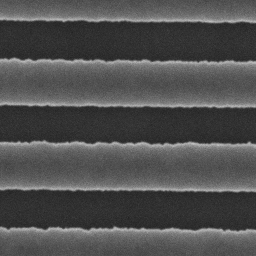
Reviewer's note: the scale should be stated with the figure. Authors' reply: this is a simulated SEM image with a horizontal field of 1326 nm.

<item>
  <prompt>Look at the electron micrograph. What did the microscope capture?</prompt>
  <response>lines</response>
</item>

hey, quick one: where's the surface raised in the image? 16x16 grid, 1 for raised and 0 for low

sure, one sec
1111111111111111
0000000000000000
0000000000000000
0000000000000000
1111111111111111
1111111111111111
1111111111111111
0000000000000000
0000000000000000
1111111111111111
1111111111111111
1111111111111111
0000000000000000
0000000000000000
1111111111111111
1111111111111111